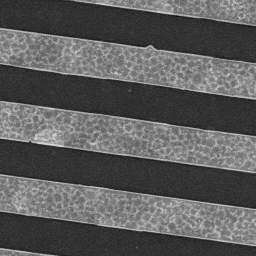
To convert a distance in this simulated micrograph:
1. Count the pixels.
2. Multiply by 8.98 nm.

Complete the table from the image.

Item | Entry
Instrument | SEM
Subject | one or a few lines or trenches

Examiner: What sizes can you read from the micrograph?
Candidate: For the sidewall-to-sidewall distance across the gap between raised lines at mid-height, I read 37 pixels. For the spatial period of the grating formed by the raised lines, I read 653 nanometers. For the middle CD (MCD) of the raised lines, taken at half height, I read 316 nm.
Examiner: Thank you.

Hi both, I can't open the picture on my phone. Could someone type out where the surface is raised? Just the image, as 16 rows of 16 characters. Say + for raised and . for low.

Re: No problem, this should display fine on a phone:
........++++++++
...............+
+++++...........
+++++++++++++...
...+++++++++++++
...........+++++
+...............
+++++++++.......
+++++++++++++++.
.......+++++++++
..............++
++++............
+++++++++++.....
..++++++++++++++
..........++++++
................